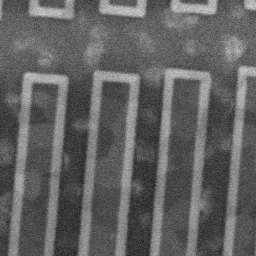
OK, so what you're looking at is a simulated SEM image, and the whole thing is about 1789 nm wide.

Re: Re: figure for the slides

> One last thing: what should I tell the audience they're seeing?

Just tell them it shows one or a few lines or trenches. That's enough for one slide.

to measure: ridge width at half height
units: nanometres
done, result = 251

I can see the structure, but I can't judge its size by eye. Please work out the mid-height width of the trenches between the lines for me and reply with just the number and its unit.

0.238 µm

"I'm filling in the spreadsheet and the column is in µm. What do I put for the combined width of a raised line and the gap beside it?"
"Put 0.494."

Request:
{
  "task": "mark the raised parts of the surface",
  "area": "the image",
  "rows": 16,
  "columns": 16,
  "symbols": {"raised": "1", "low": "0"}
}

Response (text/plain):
0011000110011000
0000000000000000
0000000000000000
0000000000000000
0000000000000000
0011001100011001
0011001100111001
0011001100111001
0111001100111001
0111001100110001
0110001100110001
0110001100110001
0110011100110011
0110011100110011
0110011100110011
0110011100110011